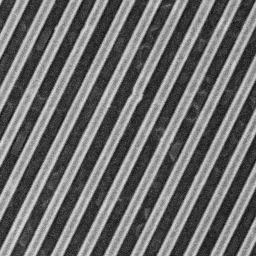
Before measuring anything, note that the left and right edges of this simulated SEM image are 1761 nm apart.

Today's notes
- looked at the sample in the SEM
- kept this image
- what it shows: parallel lines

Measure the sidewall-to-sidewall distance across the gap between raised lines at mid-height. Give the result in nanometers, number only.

94.2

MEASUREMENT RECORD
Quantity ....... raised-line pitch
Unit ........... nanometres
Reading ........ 164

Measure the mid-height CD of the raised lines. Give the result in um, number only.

0.0664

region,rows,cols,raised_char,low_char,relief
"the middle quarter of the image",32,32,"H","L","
HHHLLLLHHLLLLLHHLLLLHHHLLLLHHHLL
HHLLLLHHHLLLLHHHLLLLHHLLLLHHHLLL
HHLLLLHHLLLLLHHLLLLHHHLLLLHHHLLL
HLLLLHHHLLLLHHHLLLLHHLLLLHHHLLLL
HLLLLHHHLLLLHHLLLLHHHLLLLHHHLLLH
LLLLHHHLLLLHHHLLLLHHLLLLHHHLLLLH
LLLLHHHLLLLHHLLLLHHHLLLLHHHLLLHH
LLLHHHLLLLHHHLLLLHHHLLLHHHLLLLHH
LLLHHHLLLLHHLLLLHHHLLLLHHHLLLLHH
LLHHHLLLLHHHLLLLHHHLLLHHHLLLLHHH
LLHHHLLLLHHLLLLHHHLLLLHHHLLLLHHL
LLHHLLLLHHHLLLLHHLLLLHHHLLLLHHHL
LHHHLLLLHHLLLLHHHLLLLHHHLLLLHHLL
LHHLLLLHHHLLLLHHLLLLHHHLLLLHHHLL
HHHLLLLHHLLLLHHHLLLLHHHLLLLHHLLL
HHLLLLHHHLLLLHHLLLLHHHLLLLHHHLLL
HHLLLLHHLLLLHHHLLLLHHHLLLLHHLLLL
HLLLLHHHLLLLHHLLLLHHHLLLLHHHLLLL
HLLLLHHLLLLHHHLLLLHHHLLLHHHLLLLH
LLLLHHHLLLLHHLLLLHHHLLLLHHHLLLLH
LLLLHHLLLLHHHLLLLHHHLLLLHHLLLLHH
LLLHHHLLLLHHHLLLHHHLLLLHHHLLLLHH
LLLHHLLLLHHHLLLLHHHLLLLHHLLLLHHH
LLHHHLLLLHHHLLLHHHLLLLHHHLLLLHHL
LLHHLLLLHHHLLLLHHHLLLLHHLLLLHHHL
LHHHLLLLHHHLLLHHHLLLLHHHLLLLHHLL
LHHLLLLLHHLLLLHHHLLLLHHLLLLHHHLL
HHHLLLLHHHLLLHHHLLLLHHHLLLLHHLLL
HHLLLLLHHLLLLHHHLLLLHHLLLLHHHLLL
HHLLLLHHHLLLHHHLLLLHHHLLLLHHLLLL
HLLLLLHHLLLLHHHLLLLHHLLLLHHHLLLL
HLLLLHHHLLLLHHLLLLHHHLLLLHHLLLLL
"